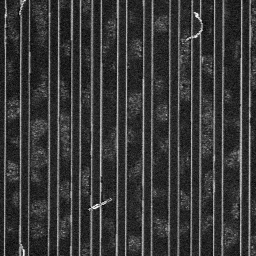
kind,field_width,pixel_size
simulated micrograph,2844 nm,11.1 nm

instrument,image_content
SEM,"parallel lines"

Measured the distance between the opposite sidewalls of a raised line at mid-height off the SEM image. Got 95.8 nm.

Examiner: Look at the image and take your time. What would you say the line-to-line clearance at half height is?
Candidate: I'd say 174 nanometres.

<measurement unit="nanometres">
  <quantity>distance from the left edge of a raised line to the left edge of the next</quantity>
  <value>272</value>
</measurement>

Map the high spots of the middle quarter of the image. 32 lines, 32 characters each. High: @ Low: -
--@@---@@-----@-----@@----@@@---
--@@---@@-----@-----@@----@@@---
--@@---@@-----@-----@@----@@@---
--@@---@@-----@-----@@----@@@---
--@@---@@-----@-----@@----@@@---
--@@---@@----@@-----@@----@@@---
--@@---@@----@@-----@@----@@@---
--@@---@@----@@-----@@----@@@---
--@@---@@----@@-----@@----@@@---
--@@---@@----@@-----@@----@@@---
--@@---@@----@@-----@@----@@@---
--@@---@@----@@-----@@----@@@---
--@@---@@----@@-----@@----@@@---
--@@---@@----@@-----@@----@@@---
--@@---@@----@@-----@@----@@@---
--@@---@@----@@-----@@----@@@---
--@@---@@----@@-----@@----@@@---
--@@---@@----@@-----@@----@@@---
--@@---@@----@@-----@@----@@@---
--@@---@@----@@-----@@----@@@---
--@@---@@----@@-----@@----@@@---
--@@---@@----@@-----@@----@@@---
--@@---@@----@@-----@@----@@@---
--@@---@@----@@-----@@----@@@---
--@@---@@----@@-----@@----@@@---
--@@---@@----@@-----@@----@@@---
--@@---@@----@@-----@@----@@@---
--@@---@@----@@-----@@----@@@---
--@@---@@----@@-----@@----@@@---
--@@---@@----@@-----@@----@@@---
--@@---@@----@@-----@@----@@@---
--@@---@@----@@-----@@----@@----